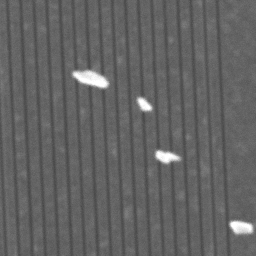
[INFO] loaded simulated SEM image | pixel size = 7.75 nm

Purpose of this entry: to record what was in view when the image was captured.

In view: parallel lines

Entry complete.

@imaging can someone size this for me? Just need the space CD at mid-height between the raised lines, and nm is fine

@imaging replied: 26.1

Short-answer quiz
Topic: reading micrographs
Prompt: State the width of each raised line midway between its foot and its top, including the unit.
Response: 78.3 nm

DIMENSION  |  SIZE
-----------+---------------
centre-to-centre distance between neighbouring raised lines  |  101 nanometres